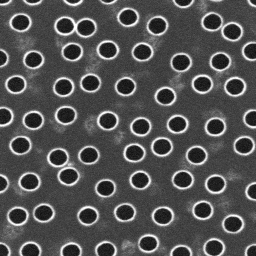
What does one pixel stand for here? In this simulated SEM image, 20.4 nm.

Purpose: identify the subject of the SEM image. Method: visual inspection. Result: a regular array of holes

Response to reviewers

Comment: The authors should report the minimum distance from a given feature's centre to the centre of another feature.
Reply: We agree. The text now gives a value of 589 nm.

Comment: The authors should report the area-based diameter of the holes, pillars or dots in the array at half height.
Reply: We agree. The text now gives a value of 17.5 pixels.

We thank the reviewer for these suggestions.